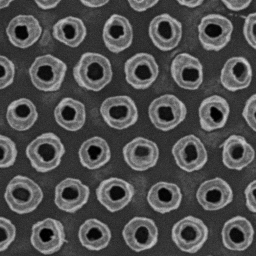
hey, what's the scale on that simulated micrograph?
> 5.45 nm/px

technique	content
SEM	a regular array of ring-shaped raised bodies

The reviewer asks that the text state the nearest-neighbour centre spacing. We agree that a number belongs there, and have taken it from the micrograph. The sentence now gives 44.6 px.